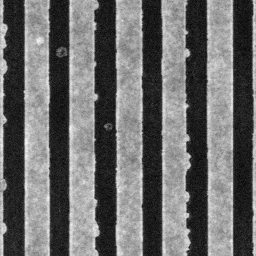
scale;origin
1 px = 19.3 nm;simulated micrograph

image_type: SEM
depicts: lines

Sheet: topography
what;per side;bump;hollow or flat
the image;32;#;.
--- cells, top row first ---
...###...###...###..###...###...
...###...###...###..###...###...
...###...###...###..###...###...
#..###...###...###..###...###...
...###...###...###..###...###...
#..###...###...###..###...###...
...###...###...###..####..###...
#..###...###...###..###...###...
#..###...###...###..###...###...
...###...###...###..###...###...
...###...###...###..###...###...
...###...###...###..###...###...
...###...###...###..###...###...
...###...###...###..###...###...
...###...###...###..###...###...
...###...###...###..###...###...
...###...###...###..###...###...
...###...###...###..###...###...
...###...###...###..###...###...
...###...###...###..####..###...
...###...###...###..####..###...
...###...###...###..###...###...
...###...###...###..###...###...
#..###...###...###..###...###...
...###...###...###..###...###...
...###...###...###..###...###...
...###...###...###..###...###...
...###...###...###..###...###...
#..###...###...###..###...###...
...###...###...###..###...###...
...###...###...###..####..###...
...###...###...###..###...###...